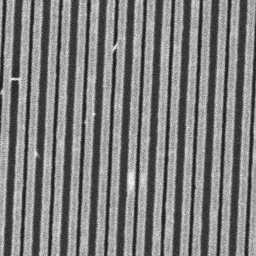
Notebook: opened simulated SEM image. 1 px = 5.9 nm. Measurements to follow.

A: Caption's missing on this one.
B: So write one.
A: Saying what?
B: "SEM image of parallel lines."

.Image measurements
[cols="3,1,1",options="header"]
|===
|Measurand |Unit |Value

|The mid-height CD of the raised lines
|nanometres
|48.6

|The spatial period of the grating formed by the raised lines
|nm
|83.2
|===